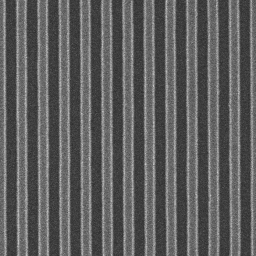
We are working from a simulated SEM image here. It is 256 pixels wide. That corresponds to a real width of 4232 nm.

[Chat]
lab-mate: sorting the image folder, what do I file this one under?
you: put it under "parallel lines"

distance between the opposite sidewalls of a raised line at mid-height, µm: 0.155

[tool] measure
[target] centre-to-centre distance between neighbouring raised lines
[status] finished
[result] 0.352 um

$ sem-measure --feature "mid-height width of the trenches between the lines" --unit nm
198